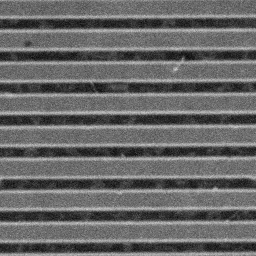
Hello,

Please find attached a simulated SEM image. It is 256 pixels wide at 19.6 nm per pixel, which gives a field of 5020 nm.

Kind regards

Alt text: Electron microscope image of parallel lines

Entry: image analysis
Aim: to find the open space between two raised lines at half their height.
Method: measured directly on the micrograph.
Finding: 255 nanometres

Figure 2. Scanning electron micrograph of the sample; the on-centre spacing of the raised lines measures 628 nm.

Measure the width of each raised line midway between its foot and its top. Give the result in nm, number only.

375